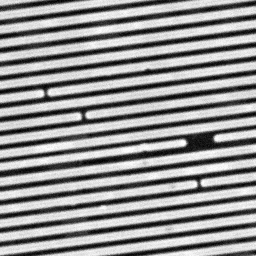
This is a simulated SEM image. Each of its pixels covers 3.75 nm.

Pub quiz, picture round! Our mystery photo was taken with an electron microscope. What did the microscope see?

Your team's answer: parallel lines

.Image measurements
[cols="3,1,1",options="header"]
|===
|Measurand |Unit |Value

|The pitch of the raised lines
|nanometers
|51.6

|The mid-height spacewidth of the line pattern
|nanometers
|28.8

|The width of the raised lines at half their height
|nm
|22.8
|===